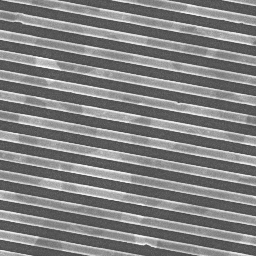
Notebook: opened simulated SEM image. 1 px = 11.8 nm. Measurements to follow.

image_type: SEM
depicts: parallel lines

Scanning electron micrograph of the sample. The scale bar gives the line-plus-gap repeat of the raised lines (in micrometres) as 0.233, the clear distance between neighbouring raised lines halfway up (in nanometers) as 131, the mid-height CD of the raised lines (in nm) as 101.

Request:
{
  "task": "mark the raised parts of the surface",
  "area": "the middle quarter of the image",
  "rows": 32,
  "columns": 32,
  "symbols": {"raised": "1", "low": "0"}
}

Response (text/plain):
11111000000000000000011111111111
11111111110000000000000000011111
00000111111111110000000000000000
00000000001111111111100000000000
00000000000000001111111111100000
11111000000000000000011111111111
11111111111000000000000000011111
00000111111111110000000000000000
00000000001111111111110000000000
00000000000000001111111111100000
11110000000000000000001111111111
11111111110000000000000000011111
00001111111111100000000000000000
00000000001111111111100000000000
00000000000000001111111111000000
11111000000000000000001111111111
11111111110000000000000000011111
00001111111111110000000000000000
00000000001111111111100000000000
00000000000000011111111111100000
11111000000000000000011111111111
11111111110000000000000000111111
00000111111111110000000000000000
00000000001111111111100000000000
00000000000000001111111111100000
11111000000000000000011111111111
11111111111000000000000000011111
00000111111111110000000000000000
00000000001111111111110000000000
00000000000000001111111111100000
11111000000000000000011111111111
11111111111000000000000000011111